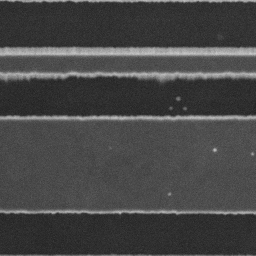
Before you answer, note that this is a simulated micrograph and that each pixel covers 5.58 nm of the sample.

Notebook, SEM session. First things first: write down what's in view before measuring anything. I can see lines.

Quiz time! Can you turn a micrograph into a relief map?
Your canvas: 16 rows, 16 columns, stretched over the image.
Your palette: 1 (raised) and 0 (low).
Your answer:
0000000000000000
0000000000000000
0000000000000000
1111111111111111
1111111111111111
0000000000000000
0000000000000000
1111111111111111
1111111111111111
1111111111111111
1111111111111111
1111111111111111
1111111111111111
0000000000000000
0000000000000000
0000000000000000